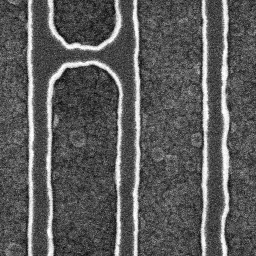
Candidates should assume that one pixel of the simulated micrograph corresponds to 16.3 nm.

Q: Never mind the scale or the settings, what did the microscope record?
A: one or a few lines or trenches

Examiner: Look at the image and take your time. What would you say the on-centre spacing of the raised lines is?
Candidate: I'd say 1.42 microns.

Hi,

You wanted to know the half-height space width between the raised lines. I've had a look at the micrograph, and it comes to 1090 nanometres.